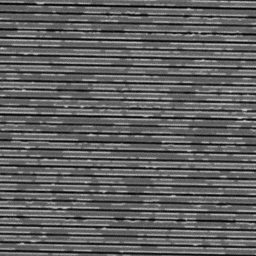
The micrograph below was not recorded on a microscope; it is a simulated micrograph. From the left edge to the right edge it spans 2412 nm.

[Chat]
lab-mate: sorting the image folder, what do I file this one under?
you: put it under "parallel lines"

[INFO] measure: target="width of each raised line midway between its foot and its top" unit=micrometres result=0.0565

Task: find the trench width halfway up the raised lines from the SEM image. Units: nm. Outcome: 18.8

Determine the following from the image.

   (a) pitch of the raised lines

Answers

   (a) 8.51 pixels